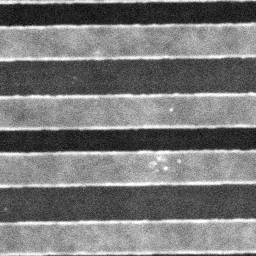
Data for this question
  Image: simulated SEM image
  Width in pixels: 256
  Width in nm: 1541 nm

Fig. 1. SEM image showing lines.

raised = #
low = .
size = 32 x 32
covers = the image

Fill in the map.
................................
................................
................................
################################
################################
################################
################################
##..............................
................................
................................
................................
................................
################################
################################
################################
################################
................................
................................
................................
################################
################################
################################
################################
................................
................................
................................
................................
..........................##.###
################################
################################
################################
################################